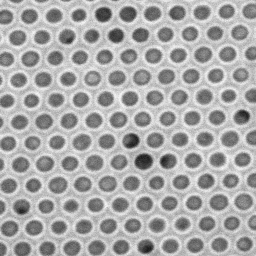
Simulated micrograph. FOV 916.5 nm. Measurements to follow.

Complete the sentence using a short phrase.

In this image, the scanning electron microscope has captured a regular array of holes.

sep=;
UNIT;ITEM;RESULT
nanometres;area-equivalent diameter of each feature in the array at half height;63.4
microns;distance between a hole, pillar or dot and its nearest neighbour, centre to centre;0.087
